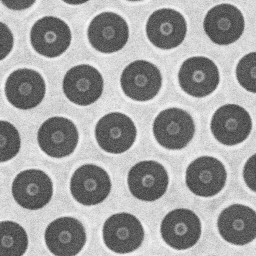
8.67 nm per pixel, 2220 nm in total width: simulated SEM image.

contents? an array of small figures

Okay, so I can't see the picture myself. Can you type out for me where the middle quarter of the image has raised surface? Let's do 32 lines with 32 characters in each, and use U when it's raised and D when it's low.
UUDDDDDDUUUUUUUDDDDDDDDDUUUUUDDD
UDDDDDDDDUUUUUUDDDDDDDDDDUUUDDDD
DDDDDDDDDDUUUUDDDDDDDDDDDUUUDDDD
DDDDDDDDDDUUUUDDDDUUDDDDDUUUDDDD
DDDDUUDDDDUUUUDDDDUUDDDDDUUUDDDD
DDDUUUDDDDUUUUDDDDDDDDDDDUUUDDDD
DDDDUDDDDDUUUUDDDDDDDDDDDUUUUDDD
DDDDDDDDDDUUUUUDDDDDDDDDUUUUUUDD
DDDDDDDDDUUUUUUDDDDDDDDUUUUUUUUU
UDDDDDDDUUUUUUUUUDDDDUUUUUUUUUUU
UUUDDDUUUUUUUUUUUUUUUUUUUDDDDUUU
UUUUUUUUUUUUUUUUUUUUUUUUDDDDDDDD
UUUUUUUUUUDDDDDDUUUUUUUDDDDDDDDD
DDUUUUUUUDDDDDDDDUUUUUUDDDDDDDDD
DDDUUUUUDDDDDDDDDDUUUUDDDDDDDDDD
DDDDUUUDDDDDDDDDDDUUUUDDDDUUUDDD
DDDDUUUDDDDDUUDDDDUUUUDDDDUUUDDD
DDDDUUUDDDDDUUDDDDDUUUDDDDDDDDDD
DDDDUUUDDDDDDDDDDDDUUUDDDDDDDDDD
DDDDUUUUDDDDDDDDDDUUUUUDDDDDDDDD
DDDDUUUUDDDDDDDDDUUUUUUDDDDDDDDD
DDDUUUUUUDDDDDDDUUUUUUUUUDDDDDDU
DDDUUUUUUUUDDDUUUUUUUUUUUUUUUUUU
DUUUUUUUUUUUUUUUUUUUUUUUUUUUUUUU
UUUUUDDDUUUUUUUUUUDDDDDDDUUUUUUD
UUUDDDDDDDUUUUUUUDDDDDDDDDUUUUDD
UUDDDDDDDDDUUUUUDDDDDDDDDDUUUUDD
UUDDDDDDDDDUUUUUDDDDDDDDDDDUUUDD
UDDDDDDDDDDDUUUUDDDDUUDDDDDUUUDD
UDDDDUUUDDDDUUUDDDDDUUDDDDDUUUDD
UDDDDUUUDDDDUUUUDDDDDDDDDDUUUUUD
UDDDDDUDDDDDUUUUDDDDDDDDDDUUUUUD